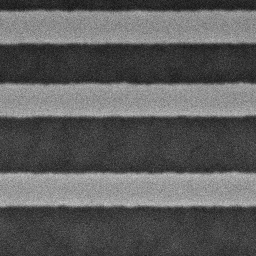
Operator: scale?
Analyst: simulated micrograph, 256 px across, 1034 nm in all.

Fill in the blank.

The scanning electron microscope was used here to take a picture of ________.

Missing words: lines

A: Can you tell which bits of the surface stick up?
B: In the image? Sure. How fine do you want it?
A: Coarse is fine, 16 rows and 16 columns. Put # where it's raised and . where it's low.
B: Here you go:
................
################
################
................
................
################
################
................
................
................
................
################
################
................
................
................